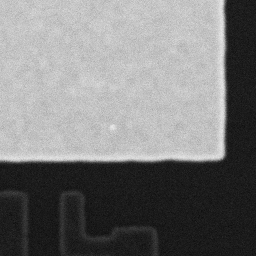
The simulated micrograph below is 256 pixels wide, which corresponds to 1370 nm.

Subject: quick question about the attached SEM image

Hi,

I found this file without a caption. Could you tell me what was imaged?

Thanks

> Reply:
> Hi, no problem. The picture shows wiring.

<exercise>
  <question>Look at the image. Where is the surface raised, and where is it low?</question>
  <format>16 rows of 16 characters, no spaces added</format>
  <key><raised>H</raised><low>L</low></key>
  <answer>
HHHHHHHHHHHHHHLL
HHHHHHHHHHHHHHLL
HHHHHHHHHHHHHHLL
HHHHHHHHHHHHHHLL
HHHHHHHHHHHHHHLL
HHHHHHHHHHHHHHLL
HHHHHHHHHHHHHHLL
HHHHHHHHHHHHHHLL
HHHHHHHHHHHHHHLL
HHHHHHHHHHHHHHLL
LLLLLLLLLLLLLLLL
LLLLLLLLLLLLLLLL
HLLLHLLLLLLLLLLL
HHLLHLLLLLLLLLLL
HHLLHLLHHLLLLLLL
HHLLHHHHHHLLLLLL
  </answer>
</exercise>